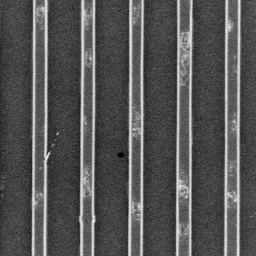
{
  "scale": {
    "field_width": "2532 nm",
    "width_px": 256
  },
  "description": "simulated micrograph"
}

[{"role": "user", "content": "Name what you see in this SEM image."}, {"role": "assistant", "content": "parallel lines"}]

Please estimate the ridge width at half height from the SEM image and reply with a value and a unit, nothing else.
126 nanometers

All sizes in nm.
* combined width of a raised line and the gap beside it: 476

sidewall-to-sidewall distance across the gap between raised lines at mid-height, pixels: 35.5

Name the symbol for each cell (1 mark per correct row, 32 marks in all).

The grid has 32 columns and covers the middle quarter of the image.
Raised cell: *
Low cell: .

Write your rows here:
.....**..........**..........***
.....**..........**..........***
.....**..........**..........***
.....**..........**..........***
.....**..........**..........***
.....**..........**..........***
.....**..........**..........***
.....**..........**..........***
.....**..........**..........***
.....**..........**..........***
.....**..........**..........***
.....**..........**..........**.
....***..........**..........**.
....***..........**..........**.
....***..........**..........**.
....***..........**..........**.
....***..........**..........**.
....***..........**..........**.
....***..........**..........***
....***..........**..........***
....***..........**..........***
....***..........**..........***
....***..........**..........***
....***..........**.........****
....***..........**.........****
....***..........**.........****
....***..........**.........****
....***..........**.........****
....***..........**.........****
....***..........**.........****
....***..........**.........****
....***..........***........****